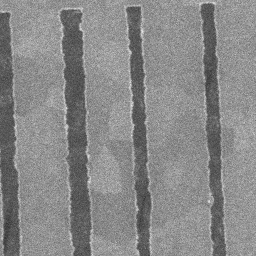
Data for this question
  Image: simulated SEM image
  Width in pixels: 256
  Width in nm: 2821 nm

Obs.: one or a few lines or trenches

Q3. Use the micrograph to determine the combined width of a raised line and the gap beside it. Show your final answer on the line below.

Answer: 747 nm